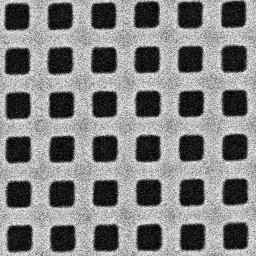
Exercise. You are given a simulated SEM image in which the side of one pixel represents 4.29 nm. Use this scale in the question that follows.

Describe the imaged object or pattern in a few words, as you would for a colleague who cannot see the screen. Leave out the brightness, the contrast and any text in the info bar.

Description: a regular array of holes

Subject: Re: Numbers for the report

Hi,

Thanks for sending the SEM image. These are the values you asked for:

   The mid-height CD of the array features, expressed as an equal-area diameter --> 120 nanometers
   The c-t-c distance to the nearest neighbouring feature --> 0.185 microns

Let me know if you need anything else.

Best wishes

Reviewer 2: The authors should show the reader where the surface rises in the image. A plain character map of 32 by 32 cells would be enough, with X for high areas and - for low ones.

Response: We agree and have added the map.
X--XXXX--XXX--XXX---XXX--XXX---X
X---XX---XX----XX---XX---XXX---X
X---XX---XX----XX---XX---XXX---X
X--XXX---XXX--XXXX-XXXX-XXXXXXXX
XXXXXXXXXXXXXXXXXXXXXXXXXXXXXXXX
XXXXXXXXXXXXXXXXXXXXXXXXXXXXXXXX
X---XX---XXX---XX---XX---XXX---X
X---XX---XX----XX---XX---XXX---X
X---XX---XX---XXX---XX---XXX---X
XXXXXXXXXXXXXXXXXXXXXXXXXXXXXXXX
XXXXXXXXXXXXXXXXXXXXXXXXXXXXXXXX
XXXXXXX--XXX--XXXX--XXX--XXX---X
X---XX---XX----XX---XX---XXX---X
X---XX---XX----XX---XX---XXX---X
X---XX---XXX--XXX---XXX--XXX--XX
XXXXXXXXXXXXXXXXXXXXXXXXXXXXXXXX
XXXXXXXXXXXXXXXXXXXXXXXXXXXXXXXX
X---XX---XXX---XX---XX---XXX---X
X---XX---XXX---XX---XX---XXX---X
X---XX---XXX---XX---XX---XXX---X
XXXXXXXXXXXXXXXXXXXXXXXXXXXXXXXX
XXXXXXXXXXXXXXXXXXXXXXXXXXXXXXXX
XXXXXXXXXXXXXXXXXX-XXXX--XXX---X
X---XX---XXX---XX---XX----XX---X
X---XX---XXX---XX---XX----XX---X
X---XX---XXX--XXX---XXX--XXX--XX
XXXXXXXXXXXXXXXXXXXXXXXXXXXXXXXX
XXXXXXXXXXXXXXXXXXXXXXXXXXXXXXXX
X---XX---XXX---XX---XXX--XXX---X
X---XX---XXX---XX---XX----XX---X
X---XX---XXX---XX---XX----XX---X
XX-XXXXXXXXXXXXXXXXXXXXXXXXXXXXX